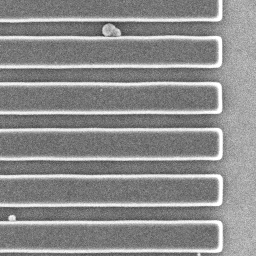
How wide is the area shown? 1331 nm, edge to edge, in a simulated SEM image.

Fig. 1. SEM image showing groups of lines, slits or small figures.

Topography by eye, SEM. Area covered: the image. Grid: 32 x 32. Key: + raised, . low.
++++++++++++++++++++++++++++....
++++++++++++++++++++++++++++....
+++++++++++++++++++++++++++.....
................................
.............+..................
++++++++++++++++++++++++++++....
++++++++++++++++++++++++++++....
++++++++++++++++++++++++++++....
................................
................................
..................+++++.........
++++++++++++++++++++++++++++....
++++++++++++++++++++++++++++....
++++++++++++++++++++++++++++....
................................
................................
+++++++++++++++++++++++++++.....
++++++++++++++++++++++++++++....
++++++++++++++++++++++++++++....
+++++++++++++++++++++++++++.....
................................
................................
++++++++++++++++++++++++++++....
++++++++++++++++++++++++++++....
++++++++++++++++++++++++++++....
+++++++++++++++++++++++++++.....
................................
................................
++++++++++++++++++++++++++++....
++++++++++++++++++++++++++++....
++++++++++++++++++++++++++++....
................................